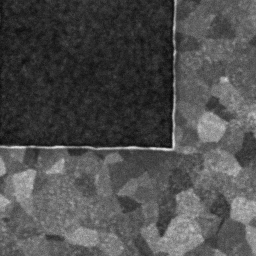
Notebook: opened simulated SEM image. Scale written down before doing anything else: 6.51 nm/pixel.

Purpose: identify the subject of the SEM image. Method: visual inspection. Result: one or a few lines or trenches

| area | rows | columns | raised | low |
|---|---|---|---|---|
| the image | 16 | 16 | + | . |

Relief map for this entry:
...........+++++
...........+++++
...........+++++
...........+++++
...........+++++
...........+++++
...........+++++
...........+++++
...........+++++
++++++++++++++++
++++++++++++++++
++++++++++++++++
++++++++++++++++
++++++++++++++++
++++++++++++++++
++++++++++++++++